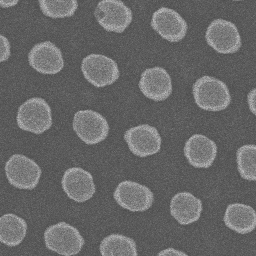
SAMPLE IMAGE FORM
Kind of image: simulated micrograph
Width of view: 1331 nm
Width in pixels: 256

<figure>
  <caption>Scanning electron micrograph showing a regular array of raised bodies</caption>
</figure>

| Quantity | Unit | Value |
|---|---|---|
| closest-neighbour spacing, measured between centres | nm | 291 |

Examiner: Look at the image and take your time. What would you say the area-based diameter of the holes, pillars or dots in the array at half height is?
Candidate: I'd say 0.168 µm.